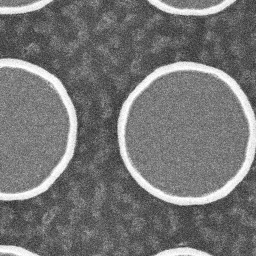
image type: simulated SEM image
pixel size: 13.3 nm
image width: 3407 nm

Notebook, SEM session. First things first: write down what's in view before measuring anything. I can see raised bodies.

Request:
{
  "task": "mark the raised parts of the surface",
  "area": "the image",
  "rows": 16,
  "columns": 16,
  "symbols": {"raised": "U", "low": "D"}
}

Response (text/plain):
UUDDDDDDDDUUUUDD
DDDDDDDDDDDDDDDD
DDDDDDDDDDDDDDDD
DDDDDDDDDDDDDDDD
UUUDDDDDDDUUUUDD
UUUUDDDDDUUUUUUD
UUUUDDDDUUUUUUUD
UUUUUDDDUUUUUUUU
UUUUUDDDUUUUUUUU
UUUUDDDDUUUUUUUU
UUUUDDDDUUUUUUUD
UUUDDDDDDUUUUUUD
DDDDDDDDDDDUUDDD
DDDDDDDDDDDDDDDD
DDDDDDDDDDDDDDDD
DDDDDDDDDDDDDDDD